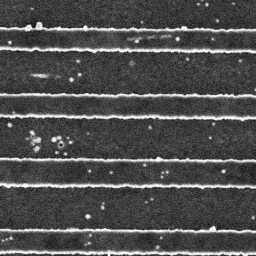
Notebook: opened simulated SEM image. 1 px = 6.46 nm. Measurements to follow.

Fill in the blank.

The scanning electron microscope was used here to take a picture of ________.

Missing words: lines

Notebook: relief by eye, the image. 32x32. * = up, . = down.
................................
................................
................................
******.*..**....................
********************************
********************************
..........................*.*..*
................................
................................
................................
................................
................................
********************************
********************************
********************************
................................
................................
................................
................................
................................
********************************
********************************
********************************
...............................*
................................
................................
................................
................................
................................
********************************
********************************
********************************